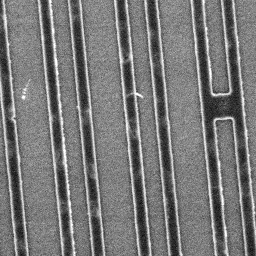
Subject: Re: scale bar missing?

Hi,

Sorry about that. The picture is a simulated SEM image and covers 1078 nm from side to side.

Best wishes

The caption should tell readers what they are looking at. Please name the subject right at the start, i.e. parallel lines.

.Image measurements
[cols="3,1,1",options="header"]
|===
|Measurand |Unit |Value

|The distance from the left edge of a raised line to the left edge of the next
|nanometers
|158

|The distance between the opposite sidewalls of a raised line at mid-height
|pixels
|12.7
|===